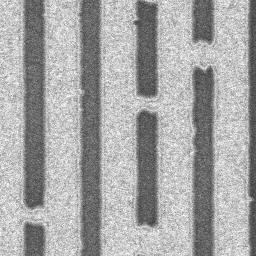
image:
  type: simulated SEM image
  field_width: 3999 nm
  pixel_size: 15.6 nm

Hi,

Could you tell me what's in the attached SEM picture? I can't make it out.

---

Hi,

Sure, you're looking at parallel lines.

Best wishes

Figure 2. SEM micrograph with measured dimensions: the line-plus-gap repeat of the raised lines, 0.879 um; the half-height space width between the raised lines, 316 nanometers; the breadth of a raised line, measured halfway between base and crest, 562 nm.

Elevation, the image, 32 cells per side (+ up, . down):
+++...++++...++++..+++++...++++.
+++...++++...++++...++++...++++.
+++...++++...++++...++++...++++.
+++...++++...++++...++++...++++.
+++...++++...++++...++++...++++.
+++...++++...++++...+++++++++++.
+++...++++...++++...+++++++++++.
+++...++++...++++...+++++++++++.
+++...++++...++++...++++.++++++.
+++...++++...++++...++++...++++.
+++...++++...++++...++++...++++.
+++...++++...++++...++++...++++.
+++...++++...+++++++++++...++++.
+++...++++...+++++++++++...++++.
+++...++++...++++...++++...++++.
+++...++++...++++...++++...++++.
+++...++++...++++...++++...++++.
+++...++++...++++...++++...++++.
+++...++++...++++...++++...++++.
+++...++++...++++...++++...++++.
+++...++++...++++...++++...++++.
+++...++++...++++...++++...++++.
+++...++++...++++...++++...++++.
+++...++++...++++...++++...++++.
+++...++++...++++...++++...++++.
+++..+++++...++++...++++...++++.
++++++++++...++++...++++...++++.
++++++++++...++++...++++...++++.
+++...++++...+++++++++++...++++.
+++...++++...+++++++++++...++++.
+++...++++...+++++++++++...++++.
+++...++++...+++++++++++...++++.